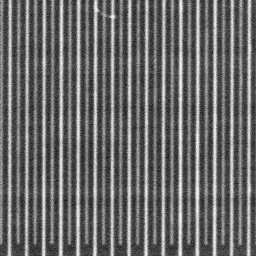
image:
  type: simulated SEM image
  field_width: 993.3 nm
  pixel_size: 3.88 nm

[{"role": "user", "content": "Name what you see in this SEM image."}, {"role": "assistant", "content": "parallel lines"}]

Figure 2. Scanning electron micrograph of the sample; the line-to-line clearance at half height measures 26.2 nm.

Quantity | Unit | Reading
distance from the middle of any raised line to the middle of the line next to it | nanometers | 33.2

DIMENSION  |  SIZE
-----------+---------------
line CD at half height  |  0.0073 um